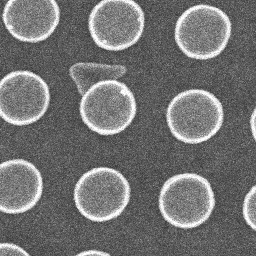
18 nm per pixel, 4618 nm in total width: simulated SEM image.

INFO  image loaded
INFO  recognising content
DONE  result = raised bodies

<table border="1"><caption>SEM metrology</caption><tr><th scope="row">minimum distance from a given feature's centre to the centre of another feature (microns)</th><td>1.53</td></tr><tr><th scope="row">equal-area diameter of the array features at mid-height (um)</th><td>0.938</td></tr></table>